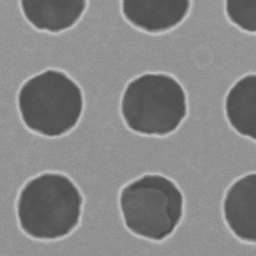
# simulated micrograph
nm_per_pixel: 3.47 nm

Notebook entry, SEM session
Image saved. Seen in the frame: holes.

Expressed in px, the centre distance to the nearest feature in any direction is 102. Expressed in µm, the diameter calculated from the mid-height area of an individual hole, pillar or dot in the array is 0.219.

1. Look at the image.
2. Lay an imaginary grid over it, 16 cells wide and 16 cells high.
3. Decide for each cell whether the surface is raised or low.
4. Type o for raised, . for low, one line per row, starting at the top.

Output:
o....ooo....oo..
oo...ooo...oooo.
oooooooooooooooo
oooooooooooooooo
ooo.oooooooooooo
o....ooo...oooo.
o....ooo....oo..
oo...ooo...ooo..
ooooooooooooooo.
oooooooooooooooo
oooooooooooooooo
oo...ooo...oooo.
o....ooo...ooo..
o....ooo...ooo..
oo..oooo...oooo.
oooooooooooooooo